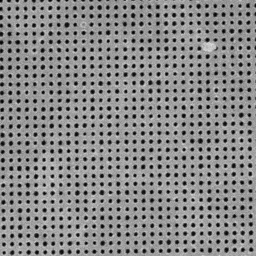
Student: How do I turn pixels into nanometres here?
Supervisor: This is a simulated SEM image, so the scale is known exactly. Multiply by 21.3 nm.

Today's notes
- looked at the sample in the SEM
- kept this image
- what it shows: a regular array of holes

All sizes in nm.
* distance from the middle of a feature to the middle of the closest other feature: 168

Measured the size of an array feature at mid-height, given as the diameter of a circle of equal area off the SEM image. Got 105 nm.